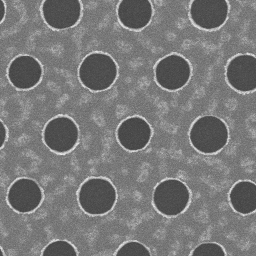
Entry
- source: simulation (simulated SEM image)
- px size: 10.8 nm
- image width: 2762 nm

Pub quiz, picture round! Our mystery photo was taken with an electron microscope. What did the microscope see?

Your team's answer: a regular array of holes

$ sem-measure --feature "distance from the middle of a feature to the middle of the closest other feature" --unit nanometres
774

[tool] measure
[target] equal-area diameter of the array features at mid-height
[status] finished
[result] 374 nanometres